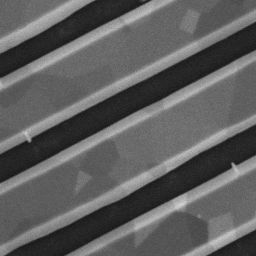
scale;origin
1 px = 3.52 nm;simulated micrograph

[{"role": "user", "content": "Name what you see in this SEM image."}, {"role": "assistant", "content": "one or a few lines or trenches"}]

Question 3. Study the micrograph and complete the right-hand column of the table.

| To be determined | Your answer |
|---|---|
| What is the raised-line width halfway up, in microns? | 0.204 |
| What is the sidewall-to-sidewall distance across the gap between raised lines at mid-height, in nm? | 122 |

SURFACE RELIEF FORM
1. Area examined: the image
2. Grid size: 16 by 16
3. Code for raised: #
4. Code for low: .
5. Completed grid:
####.....#######
###....########.
#....########...
...########.....
.########.....##
#######.....####
#####.....######
###.....########
##....########..
....########....
...#######.....#
.########....###
#######....#####
#####....#######
###....########.
......#######...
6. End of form